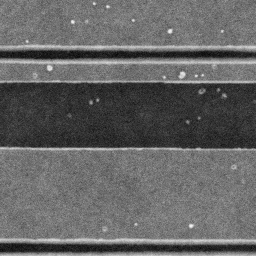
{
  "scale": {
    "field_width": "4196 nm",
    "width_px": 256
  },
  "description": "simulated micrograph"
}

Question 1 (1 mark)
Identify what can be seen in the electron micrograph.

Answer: lines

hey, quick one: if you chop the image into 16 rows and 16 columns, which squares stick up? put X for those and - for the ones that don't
XXXXXXXXXXXXXXXX
XXXXXXXXXXXXXXXX
XXXXXXXXXXXXXXXX
XXXXXXXXXXXXXXXX
XXXXXXXXXXXXXXXX
----------------
----------------
----------------
----------------
XXXXXXXXXXXXXXXX
XXXXXXXXXXXXXXXX
XXXXXXXXXXXXXXXX
XXXXXXXXXXXXXXXX
XXXXXXXXXXXXXXXX
XXXXXXXXXXXXXXXX
XXXXXXXXXXXXXXXX